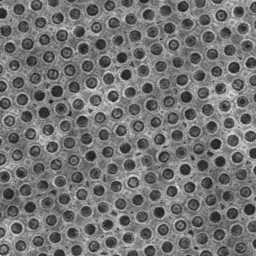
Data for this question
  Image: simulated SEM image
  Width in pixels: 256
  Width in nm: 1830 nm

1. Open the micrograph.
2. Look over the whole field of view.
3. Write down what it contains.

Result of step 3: a regular array of holes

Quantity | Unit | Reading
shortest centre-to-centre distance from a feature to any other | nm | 125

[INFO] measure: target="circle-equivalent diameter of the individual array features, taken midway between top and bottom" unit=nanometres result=88.5